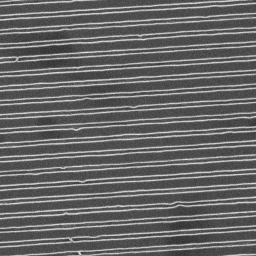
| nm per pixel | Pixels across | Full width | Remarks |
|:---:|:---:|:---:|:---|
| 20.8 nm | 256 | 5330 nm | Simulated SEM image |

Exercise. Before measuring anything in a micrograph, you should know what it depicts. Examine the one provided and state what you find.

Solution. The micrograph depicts parallel lines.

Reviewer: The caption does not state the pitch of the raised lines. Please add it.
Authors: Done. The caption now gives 294 nm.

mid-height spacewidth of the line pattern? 75.3 nanometres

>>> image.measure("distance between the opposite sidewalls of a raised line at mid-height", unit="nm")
223